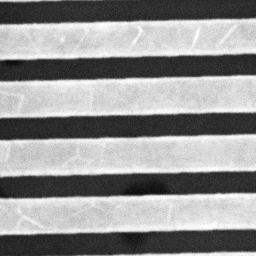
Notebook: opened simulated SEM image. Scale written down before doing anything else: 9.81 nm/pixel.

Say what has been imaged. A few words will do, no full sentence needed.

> lines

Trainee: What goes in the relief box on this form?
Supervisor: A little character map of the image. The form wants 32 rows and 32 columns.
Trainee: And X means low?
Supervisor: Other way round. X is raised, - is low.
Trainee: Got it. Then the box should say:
--------------------------------
--------------------------------
--------------------------XXXXXX
XXXXXXXXXXXXXXXXXXXXXXXXXXXXXXXX
XXXXXXXXXXXXXXXXXXXXXXXXXXXXXXXX
XXXXXXXXXXXXXXXXXXXXXXXXXXXXXXXX
XXXXXXXXXXXXXXXXXXXXXXXXXXXXXXXX
--------------------------------
--------------------------------
--------------------------------
XXXXXXXXXXXXXXXXXXXXXXXXXXXXXXXX
XXXXXXXXXXXXXXXXXXXXXXXXXXXXXXXX
XXXXXXXXXXXXXXXXXXXXXXXXXXXXXXXX
XXXXXXXXXXXXXXXXXXXXXXXXXXXXXXXX
XXXXXXXX------------------------
--------------------------------
--------------------------------
-------XXXXXXXXXXXXXXXXXXXXXXXXX
XXXXXXXXXXXXXXXXXXXXXXXXXXXXXXXX
XXXXXXXXXXXXXXXXXXXXXXXXXXXXXXXX
XXXXXXXXXXXXXXXXXXXXXXXXXXXXXXXX
XXXXXXXXXXXXXXXXXXX--X----------
--------------------------------
--------------------------------
-------------------XXXXXXXXXXXXX
XXXXXXXXXXXXXXXXXXXXXXXXXXXXXXXX
XXXXXXXXXXXXXXXXXXXXXXXXXXXXXXXX
XXXXXXXXXXXXXXXXXXXXXXXXXXXXXXXX
XXXXXXXXXXXXXXXXXXXXXXXXXXXXX-X-
--------------------------------
--------------------------------
--------------------------------